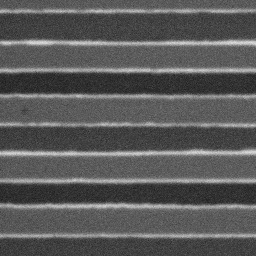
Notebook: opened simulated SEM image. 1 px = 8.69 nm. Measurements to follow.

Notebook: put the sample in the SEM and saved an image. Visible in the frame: lines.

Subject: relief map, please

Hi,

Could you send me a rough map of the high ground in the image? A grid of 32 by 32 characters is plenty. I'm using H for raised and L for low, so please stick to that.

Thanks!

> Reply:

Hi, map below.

HHHHHHHHHHHHHHHHHHHHHHHHHHHHHHHH
LLLLLLLLLLLLLLLLLLLLLLLLLLLLLLLL
LLLLLLLLLLLLLLLLLLLLLLLLLLLLLLLL
LLLLLLLLLLLLLLLLLLLLLLLLLLLLLLLL
LLLLLLLLLLLLLLLLLLLLLLLLLLLLLLLL
HHHHHHHHHHHHHHHHHHHHHHHHHHHHHHHH
HHHHHHHHHHHHHHHHHHHHHHHHHHHHHHHH
HHHHHHHHHHHHHHHHHHHHHHHHHHHHHHHH
HHHHHHHHHHHHHHHHHHHHHHHHHHHHHHHH
LLLLLLLLLLLLLLLLLLLLLLLLLLLLLLLL
LLLLLLLLLLLLLLLLLLLLLLLLLLLLLLLL
LLLLLLLLLLLLLLLLLLLLLLLLLLLLLLLL
HHHHHHHHHHHHHHHHHHHHHHHHHHHHHHHH
HHHHHHHHHHHHHHHHHHHHHHHHHHHHHHHH
HHHHHHHHHHHHHHHHHHHHHHHHHHHHHHHH
HHHHHHHHHHHHHHHHHHHHHHHHHHHHHHHH
LLLLLLLLLLLLLLLLLLLLLLLLLLLLLLLL
LLLLLLLLLLLLLLLLLLLLLLLLLLLLLLLL
LLLLLLLLLLLLLLLLLLLLLLLLLLLLLLLL
HHHHHHHHHHHHHHHHHHHHHHHHHHHHHHHH
HHHHHHHHHHHHHHHHHHHHHHHHHHHHHHHH
HHHHHHHHHHHHHHHHHHHHHHHHHHHHHHHH
HHHHHHHHHHHHHHHHHHHHHHHHHHHHHHHH
LLLLLLLLLLLLLLLLLLLLLLLLLLLLLLLL
LLLLLLLLLLLLLLLLLLLLLLLLLLLLLLLL
LLLLLLLLLLLLLLLLLLLLLLLLLLLLLLLL
HHHHHHHHHHHHHHHHHHHHHHHHHHHHHHHH
HHHHHHHHHHHHHHHHHHHHHHHHHHHHHHHH
HHHHHHHHHHHHHHHHHHHHHHHHHHHHHHHH
HLHHHLLLLLLLLLLLLLLLLLLLLLLLLLLL
LLLLLLLLLLLLLLLLLLLLLLLLLLLLLLLL
LLLLLLLLLLLLLLLLLLLLLLLLLLLLLLLL